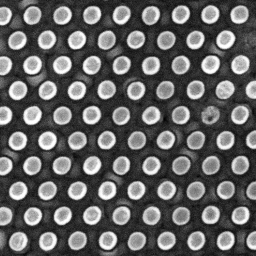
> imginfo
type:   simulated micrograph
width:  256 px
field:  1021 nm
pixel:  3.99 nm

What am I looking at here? a regular array of raised bodies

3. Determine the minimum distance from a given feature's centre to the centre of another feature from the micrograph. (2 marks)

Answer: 114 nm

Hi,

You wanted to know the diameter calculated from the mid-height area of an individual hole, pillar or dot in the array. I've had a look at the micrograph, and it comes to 17.1 pixels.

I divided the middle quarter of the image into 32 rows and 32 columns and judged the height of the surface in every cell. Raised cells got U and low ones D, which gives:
UUDDDUUUUDDDUUUUDDDDUUUUDDDUUUUD
UDDDDUUUDDDDUUUUDDDDUUUDDDDUUUUD
DDDDDDDDDDDDDDDDDDDDDDDDDDDDDDDD
DDDDDDDDDDDDDDDDDDDDDDDDDDDDDDDD
DDDDDDDDDDUDDDDDDDDDDDDDDDDDDDDD
DDUUUDDDDUUUUDDDUUUUDDDDUUUDDDDU
DUUUUDDDDUUUUDDDUUUUDDDUUUUDDDDU
DUUUUDDDDUUUDDDDUUUUDDDUUUUDDDDU
DDUUDDDDDDDDDDDDDUUDDDDDUUDDDDDD
DDDDDDDDDDDDDDDDDDDDDDDDDDDDDDDD
DDDDDDDDDDDDDDDDDDDDDDDDDDDDDDDD
UDDDDUUUUDDDDUUUDDDDUUUDDDDDUUUD
UUDDDUUUUDDDUUUUDDDDUUUUDDDUUUUD
UUDDDUUUUDDDUUUUDDDDUUUUDDDUUUUD
UDDDDUUUDDDDDUUUDDDDUUUDDDDDUUDD
DDDDDDDDDDDDDDDDDDDDDDDDDDDDDDDD
DDDDDDDDDDDDDDDDDDDDDDDDDDDDDDDD
DDUUUDDDDDUUDDDDDUUUDDDDUUUDDDDD
DUUUUDDDDUUUUDDDUUUUDDDDUUUDDDDU
DUUUUDDDDUUUUDDDUUUUDDDUUUUDDDDU
DDUUUDDDDUUUDDDDDUUUDDDDUUUDDDDU
DDDDDDDDDDDDDDDDDDDDDDDDDDDDDDDD
DDDDDDDDDDDDDDDDDDDDDDDDDDDDDDDD
DDDDDDUUDDDDDDUDDDDDDUUDDDDDDUUD
UUDDDUUUUDDDDUUUDDDDUUUUDDDUUUUD
UUDDDUUUUDDDUUUUDDDDUUUUDDDUUUUD
UDDDDUUUUDDDUUUUDDDDUUUDDDDUUUUD
DDDDDDDDDDDDDDDDDDDDDUDDDDDDDDDD
DDDDDDDDDDDDDDDDDDDDDDDDDDDDDDDD
DDDDDDDDDDDDDDDDDDUDDDDDDUUDDDDD
DDUUUDDDDUUUUDDDUUUUDDDDUUUDDDDU
DUUUUUDDDUUUUDDDUUUUDDDDUUUUDDDU